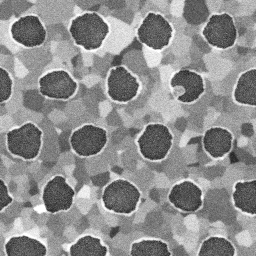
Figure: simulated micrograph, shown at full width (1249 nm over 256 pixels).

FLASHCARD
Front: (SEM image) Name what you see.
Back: a regular array of holes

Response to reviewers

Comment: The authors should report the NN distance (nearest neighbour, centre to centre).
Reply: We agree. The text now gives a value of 306 nm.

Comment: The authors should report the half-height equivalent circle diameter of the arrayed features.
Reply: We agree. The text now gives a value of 164 nm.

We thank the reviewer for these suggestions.